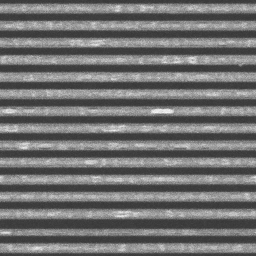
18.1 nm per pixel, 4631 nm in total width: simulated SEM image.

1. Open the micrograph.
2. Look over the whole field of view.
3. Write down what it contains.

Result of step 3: parallel lines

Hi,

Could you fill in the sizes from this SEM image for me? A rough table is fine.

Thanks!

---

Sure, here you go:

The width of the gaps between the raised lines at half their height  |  142 nm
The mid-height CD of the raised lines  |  170 nm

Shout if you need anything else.